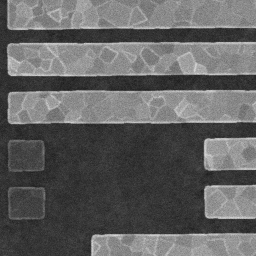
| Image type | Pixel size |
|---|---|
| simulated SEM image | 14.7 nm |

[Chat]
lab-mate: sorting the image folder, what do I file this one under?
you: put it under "wiring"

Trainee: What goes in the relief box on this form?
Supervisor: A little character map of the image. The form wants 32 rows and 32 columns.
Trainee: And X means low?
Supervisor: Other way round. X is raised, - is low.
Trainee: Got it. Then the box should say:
-XXXXXXXXXXXXXXXXXXXXXXXXXXXXXXX
-XXXXXXXXXXXXXXXXXXXXXXXXXXXXXXX
-XXXXXXXXXXXXXXXXXXXXXXXXXXXXXXX
-XXXXXXXXX------XXXX------------
--------------------------------
--XXXXXXXXXXXXXXXXXXXXXXXXXXXXXX
-XXXXXXXXXXXXXXXXXXXXXXXXXXXXXXX
-XXXXXXXXXXXXXXXXXXXXXXXXXXXXXXX
-XXXXXXXXXXXXXXXXXXXXXXXXXXXXXXX
--------------------------------
--------------------------------
-------XXXXXXXXXXXXXXXXXXXXXXXXX
-XXXXXXXXXXXXXXXXXXXXXXXXXXXXXXX
-XXXXXXXXXXXXXXXXXXXXXXXXXXXXXXX
-XXXXXXXXXXXXXXXXXXXXXXXXXXXXXXX
--------------------------------
--------------------------------
--------------------------XXXXXX
-XXXX---------------------XXXXXX
-XXXX---------------------XXXXXX
-XXXX---------------------XXXXXX
--------------------------------
--------------------------------
-XXXX---------------------XXXXXX
-XXXXX--------------------XXXXXX
-XXXX---------------------XXXXXX
-XXXX---------------------XXXXXX
--------------------------------
--------------------------------
------------XXXXXXXXXXXXXXXXXXXX
-----------XXXXXXXXXXXXXXXXXXXXX
-----------XXXXXXXXXXXXXXXXXXXXX